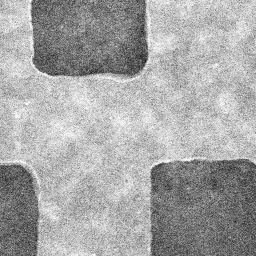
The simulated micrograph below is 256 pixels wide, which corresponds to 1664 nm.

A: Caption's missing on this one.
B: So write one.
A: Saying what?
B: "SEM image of holes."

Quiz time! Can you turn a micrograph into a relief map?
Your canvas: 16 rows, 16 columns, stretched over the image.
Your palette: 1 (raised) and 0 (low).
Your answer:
1100000001111111
1100000001111111
1100000001111111
1100000001111111
1110000001111111
1111111111111111
1111111111111111
1111111111111111
1111111111111111
1111111111111111
0011111111000000
0011111110000000
0011111110000000
0011111110000000
0011111110000000
0011111110000000